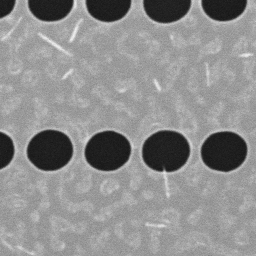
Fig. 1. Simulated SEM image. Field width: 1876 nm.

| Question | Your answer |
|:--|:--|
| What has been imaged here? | holes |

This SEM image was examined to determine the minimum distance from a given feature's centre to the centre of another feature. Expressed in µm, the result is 0.425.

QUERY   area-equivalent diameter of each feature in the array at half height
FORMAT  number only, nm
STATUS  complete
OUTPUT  321